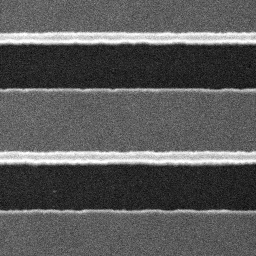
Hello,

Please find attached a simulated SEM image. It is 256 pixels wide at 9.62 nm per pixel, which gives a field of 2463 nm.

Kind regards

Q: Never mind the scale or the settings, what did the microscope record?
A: lines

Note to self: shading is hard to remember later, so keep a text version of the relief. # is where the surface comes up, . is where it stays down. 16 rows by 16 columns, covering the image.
################
################
################
................
................
................
################
################
################
################
................
................
................
################
################
################